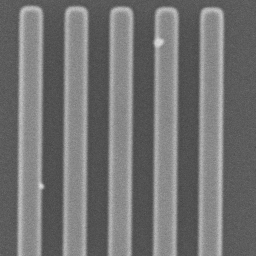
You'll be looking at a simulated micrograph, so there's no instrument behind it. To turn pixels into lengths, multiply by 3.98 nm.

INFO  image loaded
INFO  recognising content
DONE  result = groups of lines, slits or small figures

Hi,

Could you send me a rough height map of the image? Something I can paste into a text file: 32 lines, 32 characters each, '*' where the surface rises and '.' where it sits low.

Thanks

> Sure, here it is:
................................
...**...***...**....**...***....
...**...***...***...**...***....
...**...***...***...**...***....
...**...***...***..***...***....
...**...***...***..***...***....
...**...***...***...**...***....
...**...***...**....**...***....
...**...***...**....**...***....
..***...***...**...***...***....
..***...***...**...***...***....
..***...***...**...***...***....
..***...***...**...***...***....
..***...***...**...***...***....
..***...***...**...***...***....
..***...***...**...***...***....
..***...***...**...***...***....
..***...***...**...***...***....
..***...***...**...***...***....
..***...***...**...***...***....
..***...***...**...***...***....
..***...***...**...***...***....
..***...***...**...***...***....
..***...***...**...***...***....
..***...***...**...***...***....
..***...***...**...***...***....
..***...***...**...***...***....
..***...***...**...***...***....
..***...***...**...***...***....
..***...***...**...***...***....
..***...***...**...***...***....
..***...***...**...***...***....